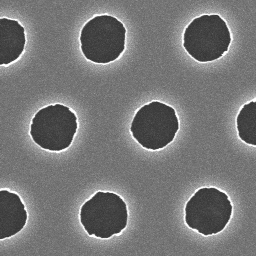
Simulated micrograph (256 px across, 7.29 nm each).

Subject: holes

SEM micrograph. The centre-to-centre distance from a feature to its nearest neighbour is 736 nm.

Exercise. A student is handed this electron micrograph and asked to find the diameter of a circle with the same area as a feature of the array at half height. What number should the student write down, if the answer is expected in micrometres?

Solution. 0.342